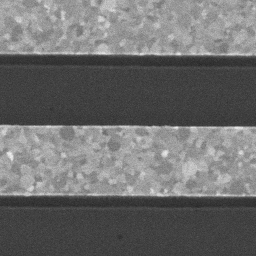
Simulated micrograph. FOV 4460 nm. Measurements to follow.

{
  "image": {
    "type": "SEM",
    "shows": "lines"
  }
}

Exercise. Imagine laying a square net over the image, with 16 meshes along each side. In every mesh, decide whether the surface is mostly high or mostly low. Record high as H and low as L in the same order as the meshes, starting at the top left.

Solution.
HHHHHHHHHHHHHHHH
HHHHHHHHHHHHHHHH
HHHHHHHHHHHHHHHH
LLLLLLLLLLLLLLLL
LLLLLLLLLLLLLLLL
LLLLLLLLLLLLLLLL
LLLLLLLLLLLLLLLL
LLLLLLLLLLLLLLLL
HHHHHHHHHHHHHHHH
HHHHHHHHHHHHHHHH
HHHHHHHHHHHHHHHH
HHHHHHHHHHHHHHHH
LLLLLLLLLLLLLLLL
LLLLLLLLLLLLLLLL
LLLLLLLLLLLLLLLL
LLLLLLLLLLLLLLLL